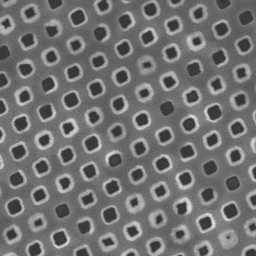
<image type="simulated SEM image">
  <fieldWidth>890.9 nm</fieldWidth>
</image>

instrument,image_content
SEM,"a regular array of holes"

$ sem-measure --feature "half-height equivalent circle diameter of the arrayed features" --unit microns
0.0425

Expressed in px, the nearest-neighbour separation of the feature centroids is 27.1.